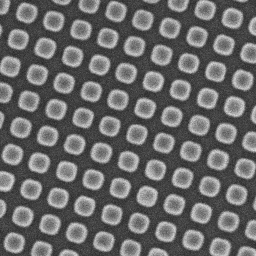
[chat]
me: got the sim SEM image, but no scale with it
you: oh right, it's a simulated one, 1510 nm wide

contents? a regular array of raised bodies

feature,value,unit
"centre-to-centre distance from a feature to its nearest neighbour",164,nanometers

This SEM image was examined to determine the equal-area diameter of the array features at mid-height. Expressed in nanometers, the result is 118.